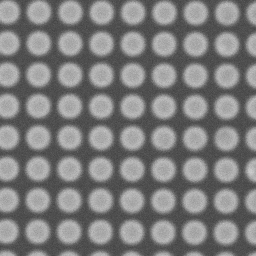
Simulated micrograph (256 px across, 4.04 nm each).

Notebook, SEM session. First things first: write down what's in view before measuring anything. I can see an array of small figures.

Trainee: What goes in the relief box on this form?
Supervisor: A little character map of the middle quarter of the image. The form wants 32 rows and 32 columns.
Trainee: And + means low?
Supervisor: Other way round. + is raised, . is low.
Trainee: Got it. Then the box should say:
+++.....+++.....+++....++++....+
++++...+++++...+++++..++++++..++
++++...+++++..++++++..++++++..++
++++...+++++...+++++..++++++..++
++++...+++++...+++++...++++...++
.+......++......++......++.....+
................................
................................
+++....++++....++++....++++....+
++++...+++++..++++++..++++++..++
++++..++++++..++++++..++++++..++
++++..++++++..++++++..++++++..++
++++...+++++...++++....++++...++
................................
................................
................................
++++...++++....++++....++++....+
++++...+++++..++++++..++++++..++
++++..++++++..++++++..++++++..++
++++..++++++..++++++..++++++..++
+++....++++....++++....++++....+
................................
................................
................................
++++...++++....++++....++++....+
++++..++++++..++++++..++++++..++
++++..++++++..++++++..++++++..++
++++...+++++..++++++..+++++...++
+++....++++....++++....++++....+
................................
................................
++......++......++......++......